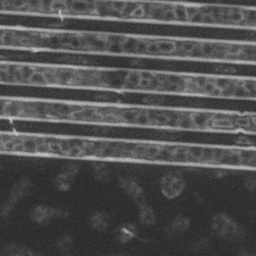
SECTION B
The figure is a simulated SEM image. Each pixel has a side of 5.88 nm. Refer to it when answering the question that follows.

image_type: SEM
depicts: parallel lines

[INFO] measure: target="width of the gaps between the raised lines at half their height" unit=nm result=74.8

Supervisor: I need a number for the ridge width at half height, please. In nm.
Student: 130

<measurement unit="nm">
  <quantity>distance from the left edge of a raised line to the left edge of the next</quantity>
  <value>206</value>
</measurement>